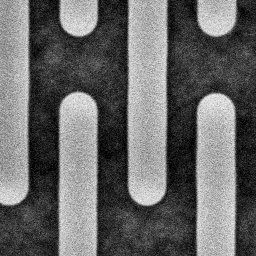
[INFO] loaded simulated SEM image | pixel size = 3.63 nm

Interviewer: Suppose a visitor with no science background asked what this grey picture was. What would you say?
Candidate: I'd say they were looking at groups of lines, slits or small figures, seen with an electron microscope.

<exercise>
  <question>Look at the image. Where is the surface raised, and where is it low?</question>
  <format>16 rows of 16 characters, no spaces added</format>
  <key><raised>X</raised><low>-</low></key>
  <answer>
XX--XX--XX--XXX-
XX--XX--XX---XX-
XX------XX------
XX------XX------
XX------XX------
XX------XX------
XX--XX--XX---X--
XX--XX--XX--XXX-
XX--XX--XX--XXX-
XX--XX--XX--XXX-
XX--XX--XX--XXX-
XX--XX--XX--XXX-
X---XX--XX--XXX-
----XX------XXX-
----XX------XXX-
----XX------XXX-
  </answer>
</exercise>